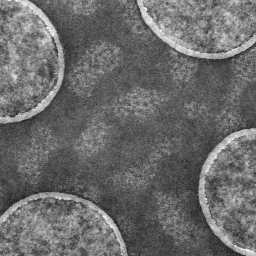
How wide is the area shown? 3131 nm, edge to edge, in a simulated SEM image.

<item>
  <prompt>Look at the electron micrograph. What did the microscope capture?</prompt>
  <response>raised bodies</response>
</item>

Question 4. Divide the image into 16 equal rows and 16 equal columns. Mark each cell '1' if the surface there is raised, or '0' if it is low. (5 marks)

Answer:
1100000001111111
1110000001111111
1111000000111111
1111000000000100
1111000000000000
1111000000000000
1110000000000000
1000000000000000
0000000000000001
0000000000000111
0000000000000111
0000000000000111
0011100000000111
1111111000000111
1111111000000011
1111111100000001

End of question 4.